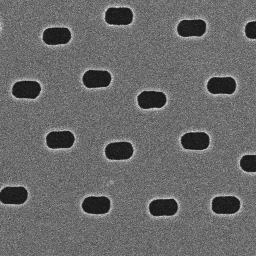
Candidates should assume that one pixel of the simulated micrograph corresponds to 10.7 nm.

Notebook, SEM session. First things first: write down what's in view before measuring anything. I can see a regular array of holes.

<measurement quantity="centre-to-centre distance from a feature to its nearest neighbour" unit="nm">643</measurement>